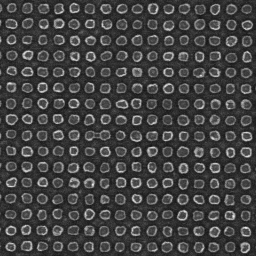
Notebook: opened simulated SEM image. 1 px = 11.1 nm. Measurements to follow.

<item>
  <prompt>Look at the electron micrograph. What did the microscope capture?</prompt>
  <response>a regular array of raised bodies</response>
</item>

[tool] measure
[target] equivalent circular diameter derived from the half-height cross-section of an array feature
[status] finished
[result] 110 nanometers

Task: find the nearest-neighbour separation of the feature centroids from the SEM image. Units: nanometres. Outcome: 170